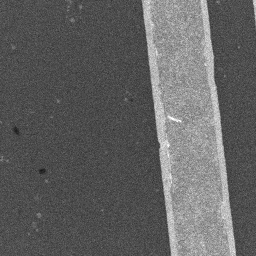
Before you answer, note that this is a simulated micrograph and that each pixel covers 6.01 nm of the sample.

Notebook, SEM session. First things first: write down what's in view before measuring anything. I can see one or a few lines or trenches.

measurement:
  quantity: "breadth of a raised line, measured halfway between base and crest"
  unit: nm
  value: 347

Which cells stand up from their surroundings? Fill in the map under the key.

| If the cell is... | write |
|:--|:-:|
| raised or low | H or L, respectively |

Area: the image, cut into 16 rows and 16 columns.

LLLLLLLLLHHHHLLL
LLLLLLLLLHHHHLLL
LLLLLLLLLHHHHLLL
LLLLLLLLLHHHHLLL
LLLLLLLLLLHHHLLL
LLLLLLLLLLHHHLLL
LLLLLLLLLLHHHLLL
LLLLLLLLLLHHHHLL
LLLLLLLLLLHHHHLL
LLLLLLLLLLHHHHLL
LLLLLLLLLLHHHHLL
LLLLLLLLLLHHHHLL
LLLLLLLLLLLHHHLL
LLLLLLLLLLLHHHLL
LLLLLLLLLLLHHHLL
LLLLLLLLLLLHHHHL